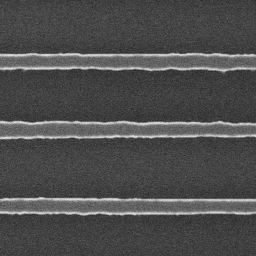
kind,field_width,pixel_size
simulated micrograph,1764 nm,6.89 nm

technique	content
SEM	lines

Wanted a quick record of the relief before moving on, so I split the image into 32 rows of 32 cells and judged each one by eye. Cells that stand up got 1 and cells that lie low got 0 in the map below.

00000000000000000000000000000000
00000000000000000000000000000000
00000000000000000000000000000000
00000000000000000000000000000000
00000000000000000000000000000000
00000000000000000000000000000000
00000000000000000000000000000000
11111111111111111111111111111111
11111111111111111111111111111111
00000000000000000000000000000000
00000000000000000000000000000000
00000000000000000000000000000000
00000000000000000000000000000000
00000000000000000000000000000000
00000000000000000000000000000000
11111111111111111111111111111111
11111111111111111111111111111111
00000000000000000000000000000000
00000000000000000000000000000000
00000000000000000000000000000000
00000000000000000000000000000000
00000000000000000000000000000000
00000000000000000000000000000000
00000000000000000000000000000000
00000000000000000000000000000000
11111111111111111111111111111111
11111111111111111111111111111111
00000000000000000000000000000000
00000000000000000000000000000000
00000000000000000000000000000000
00000000000000000000000000000000
00000000000000000000000000000000